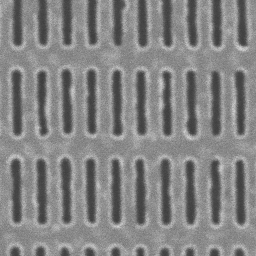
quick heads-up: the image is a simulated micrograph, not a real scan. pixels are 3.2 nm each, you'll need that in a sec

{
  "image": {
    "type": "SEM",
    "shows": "a regular array of holes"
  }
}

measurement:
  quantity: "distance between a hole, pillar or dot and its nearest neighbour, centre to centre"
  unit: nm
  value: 78.7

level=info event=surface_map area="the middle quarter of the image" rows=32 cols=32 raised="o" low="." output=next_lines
oooooooooooooooooooooooooooooooo
.ooooo.ooooooooooooooooooooooooo
..oooo..oooo..oooo..ooooo..ooo..
..oooo..oooo..oooo..ooooo..ooo..
..oooo..oooo..oooo..ooooo..oooo.
..oooo..oooo..oooo..ooooo..oooo.
..oooo..oooo..oooo..ooooo..ooo..
..oooo..oooo..oooo..ooooo..oooo.
..oooo..oooo..oooo..ooooo..oooo.
..oooo..oooo..oooo..ooooo..oooo.
..oooo..oooo...ooo..ooooo..oooo.
..oooo..oooo...ooo..ooooo..oooo.
..oooo..oooo..oooo..ooooo..oooo.
..oooo..oooo..oooo..ooooo..oooo.
..oooo..oooo...ooo...oooo..oooo.
..oooo..oooo...ooo...oooo..oooo.
..oooo..oooo...ooo...oooo..oooo.
ooooooo.oooo..ooooo.ooooo..oooo.
oooooooooooooooooooooooooooooooo
oooooooooooooooooooooooooooooooo
oooooooooooooooooooooooooooooooo
oooooooooooooooooooooooooooooooo
oooooooooooooooooooooooooooooooo
oooooooooooooooooooooooooooooooo
.ooooo..oooo..oooo..oooo..ooooo.
..ooo...oooo..oooo..oooo...ooo..
..ooo...oooo..oooo..oooo...ooo..
..ooo...oooo..oooo..oooo...ooo..
..ooo...oooo..oooo..oooo..ooooo.
..ooo...oooo..oooo..oooo..ooooo.
..ooo...oooo..oooo..oooo..ooooo.
..oooo..oooo..oooo...ooo..ooooo.